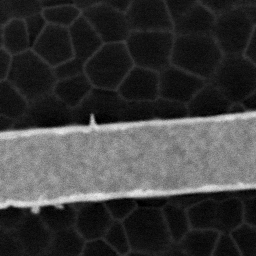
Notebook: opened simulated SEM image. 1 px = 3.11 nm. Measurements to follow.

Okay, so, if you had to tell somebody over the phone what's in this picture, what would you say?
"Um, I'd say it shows one or a few lines or trenches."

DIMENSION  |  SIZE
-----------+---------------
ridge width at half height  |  0.221 µm